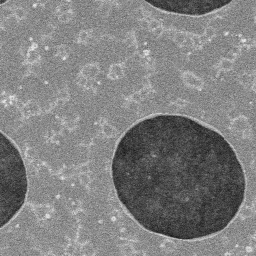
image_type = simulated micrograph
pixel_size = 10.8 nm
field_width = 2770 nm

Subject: holes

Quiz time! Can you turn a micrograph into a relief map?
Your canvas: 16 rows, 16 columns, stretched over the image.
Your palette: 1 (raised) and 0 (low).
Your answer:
1111111111000011
1111111111111111
1111111111111111
1111111111111111
1111111111111111
1111111111111111
1111111111111111
1111111110001111
1111111100000011
0111111000000001
0011111000000001
0011111000000001
0011111000000001
0111111100000001
1111111111000011
1111111111111111